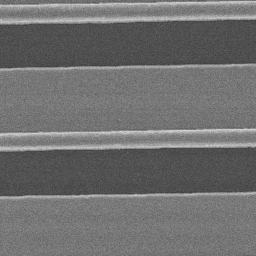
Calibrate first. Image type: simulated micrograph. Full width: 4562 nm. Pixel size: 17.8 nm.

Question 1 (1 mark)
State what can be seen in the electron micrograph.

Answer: lines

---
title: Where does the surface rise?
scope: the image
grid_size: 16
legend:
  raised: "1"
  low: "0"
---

1111111111111111
0000000000000000
0000000000000000
0000000000000000
1111111111111111
1111111111111111
1111111111111111
1111111111111111
1111111111111111
0000000000000000
0000000000000000
0000000000000000
1111111111111111
1111111111111111
1111111111111111
1111111111111111